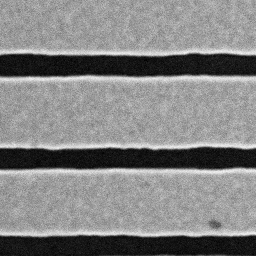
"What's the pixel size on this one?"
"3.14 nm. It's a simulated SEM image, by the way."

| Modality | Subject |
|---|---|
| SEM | lines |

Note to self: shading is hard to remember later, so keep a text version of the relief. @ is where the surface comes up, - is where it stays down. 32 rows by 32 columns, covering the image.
@@@@@@@@@@@@@@@@@@@@@@@@@@@@@@@@
@@@@@@@@@@@@@@@@@@@@@@@@@@@@@@@@
@@@@@@@@@@@@@@@@@@@@@@@@@@@@@@@@
@@@@@@@@@@@@@@@@@@@@@@@@@@@@@@@@
@@@@@@@@@@@@@@@@@@@@@@@@@@@@@@@@
@@@@@@@@@@@@@@@@@@@@@@@@@@@@@@@@
@@@@@@@@@@@@@@@@@@@@@@@@@@@@@@@@
--------------------------------
--------------------------------
----------@@----------@@@@@-----
@@@@@@@@@@@@@@@@@@@@@@@@@@@@@@@@
@@@@@@@@@@@@@@@@@@@@@@@@@@@@@@@@
@@@@@@@@@@@@@@@@@@@@@@@@@@@@@@@@
@@@@@@@@@@@@@@@@@@@@@@@@@@@@@@@@
@@@@@@@@@@@@@@@@@@@@@@@@@@@@@@@@
@@@@@@@@@@@@@@@@@@@@@@@@@@@@@@@@
@@@@@@@@@@@@@@@@@@@@@@@@@@@@@@@@
@@@@@@@@@@@@@@@@@@@@@@@@@@@@@@@@
@@@@@@@@@@@@@@@@@@@@@@@@@----@@@
--------------------------------
--------------------------------
@@@@@@@@@@@@@@@@@@@@@@@@@@@@@@@@
@@@@@@@@@@@@@@@@@@@@@@@@@@@@@@@@
@@@@@@@@@@@@@@@@@@@@@@@@@@@@@@@@
@@@@@@@@@@@@@@@@@@@@@@@@@@@@@@@@
@@@@@@@@@@@@@@@@@@@@@@@@@@@@@@@@
@@@@@@@@@@@@@@@@@@@@@@@@@@@@@@@@
@@@@@@@@@@@@@@@@@@@@@@@@@@@@@@@@
@@@@@@@@@@@@@@@@@@@@@@@@@@@@@@@@
--------------------------------
--------------------------------
--------------------------------